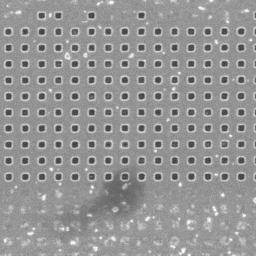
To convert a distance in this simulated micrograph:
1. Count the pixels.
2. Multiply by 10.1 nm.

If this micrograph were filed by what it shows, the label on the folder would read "a regular array of holes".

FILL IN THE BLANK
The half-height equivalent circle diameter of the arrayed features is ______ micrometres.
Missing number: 0.0781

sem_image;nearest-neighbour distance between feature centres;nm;162